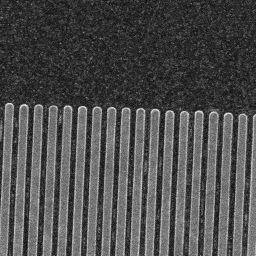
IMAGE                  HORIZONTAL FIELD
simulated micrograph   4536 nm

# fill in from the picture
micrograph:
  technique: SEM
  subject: parallel lines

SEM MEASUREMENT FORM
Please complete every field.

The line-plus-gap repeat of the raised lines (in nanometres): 258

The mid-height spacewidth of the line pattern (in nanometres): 115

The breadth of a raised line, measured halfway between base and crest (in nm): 148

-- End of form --